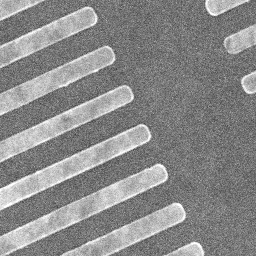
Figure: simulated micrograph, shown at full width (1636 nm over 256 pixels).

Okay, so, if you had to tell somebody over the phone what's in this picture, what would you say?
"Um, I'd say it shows parallel lines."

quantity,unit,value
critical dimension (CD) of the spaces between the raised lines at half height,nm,157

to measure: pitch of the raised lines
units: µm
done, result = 0.273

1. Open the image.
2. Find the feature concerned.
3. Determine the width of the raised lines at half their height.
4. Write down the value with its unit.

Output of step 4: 120 nm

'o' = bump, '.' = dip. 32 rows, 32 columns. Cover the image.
oooo......................oooo..
oo.......ooo..............oo....
.......ooooo....................
.....oooooo....................o
...oooooo....................ooo
.oooooo.....................oooo
oooo........oo...............o..
oo.......ooooo..................
.......oooooo...................
.....oooooo....................o
...oooooo.....................oo
.ooooo........oo...............o
oooo........oooo................
oo.......oooooo.................
.......oooooo...................
.....ooooo......................
...ooooo........ooo.............
.ooooo.......oooooo.............
oooo.......oooooo...............
o........ooooo..................
.......ooooo....................
.....ooooo........ooo...........
..oooooo.......oooooo...........
oooooo.......oooooo.............
oooo.......oooooo...............
oo.......ooooo..................
.......ooooo.......oooo.........
.....ooooo.......oooooo.........
..oooooo.......oooooo...........
oooooo.......oooooo.............
oooo.......oooooo.......o.......
o.......oooooo........ooo.......